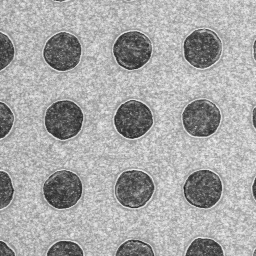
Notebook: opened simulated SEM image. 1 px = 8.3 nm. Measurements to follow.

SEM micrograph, a regular array of holes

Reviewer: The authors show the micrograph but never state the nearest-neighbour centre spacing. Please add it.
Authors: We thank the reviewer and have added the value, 572 nm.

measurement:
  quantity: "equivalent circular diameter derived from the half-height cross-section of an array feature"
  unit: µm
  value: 0.322